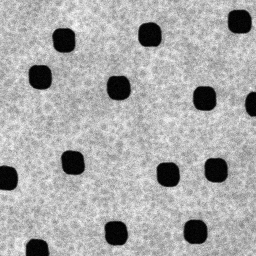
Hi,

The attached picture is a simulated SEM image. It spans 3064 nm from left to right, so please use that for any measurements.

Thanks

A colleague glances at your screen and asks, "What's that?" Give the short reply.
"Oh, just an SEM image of a regular array of holes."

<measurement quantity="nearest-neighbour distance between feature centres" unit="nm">736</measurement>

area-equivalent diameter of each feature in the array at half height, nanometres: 302